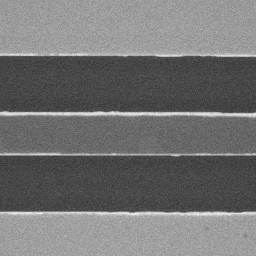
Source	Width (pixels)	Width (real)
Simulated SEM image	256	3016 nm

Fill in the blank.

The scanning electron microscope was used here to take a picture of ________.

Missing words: lines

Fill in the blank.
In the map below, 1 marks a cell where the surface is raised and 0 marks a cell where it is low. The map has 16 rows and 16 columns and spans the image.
1111111111111111
1111111111111111
1111111111111111
0000000000000000
0000000000000000
0000000000000000
0000000000000000
1111111111111111
1111111111111111
1111111111111111
0000000000000000
0000000000000000
0000000000000000
1111111111111111
1111111111111111
1111111111111111